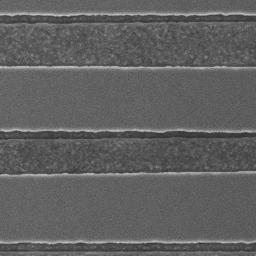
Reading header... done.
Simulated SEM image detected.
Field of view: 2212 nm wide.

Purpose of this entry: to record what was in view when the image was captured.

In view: lines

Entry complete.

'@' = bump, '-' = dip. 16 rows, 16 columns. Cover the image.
@@@@@@@@@@@@@@@@
----------------
----------------
----------------
@@@@@@@@@@@@@@@@
@@@@@@@@@@@@@@@@
@@@@@@@@@@@@@@@@
@@@@@@@@@@@@@@@@
----------------
----------------
----------------
@@@@@@@@@@@@@@@@
@@@@@@@@@@@@@@@@
@@@@@@@@@@@@@@@@
@@@@@@@@@@@@@@@@
----------------